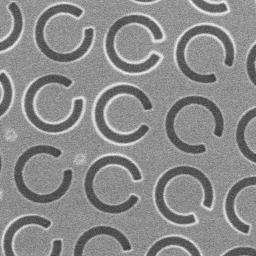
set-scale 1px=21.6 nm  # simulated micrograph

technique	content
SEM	an array of small figures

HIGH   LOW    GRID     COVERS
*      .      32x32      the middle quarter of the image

************...........*****...*
**************.......********...
****************...***********..
.******************************.
..******************************
..**********......**************
**********.........*************
*********...........************
****.***.....*****...********...
**...***...********...******....
**...***...*********..*****....*
**...**...**********.*****...***
**...**...****************..****
*...***...***************...****
....****...**************...****
..******...********..****...****
.*******.....*****...****...****
*********............*****..****
**********.........*******...***
************......*********...**
***************************.....
*****************************...
************.******************.
*********.......****************
*******..........***************
*******....***....**********...*
*.****...*******...*******......
..***...*********..******.......
..***...*********..*****....****
..***..****************...******
..***..****************...******
.****...***************..*******